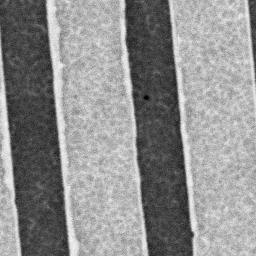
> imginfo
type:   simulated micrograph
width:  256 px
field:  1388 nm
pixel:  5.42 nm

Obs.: one or a few lines or trenches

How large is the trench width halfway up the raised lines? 0.269 µm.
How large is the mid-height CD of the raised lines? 0.401 micrometres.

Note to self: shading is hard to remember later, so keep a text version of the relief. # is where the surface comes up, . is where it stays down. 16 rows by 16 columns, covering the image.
...#####...####.
...#####...#####
...#####...#####
...#####...#####
...#####...#####
...#####...#####
....####...#####
....####...#####
#...####...#####
#...####....####
#...#####...####
#...#####...####
#...#####...####
#...#####...####
#...#####...####
#...#####...####